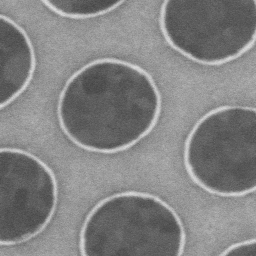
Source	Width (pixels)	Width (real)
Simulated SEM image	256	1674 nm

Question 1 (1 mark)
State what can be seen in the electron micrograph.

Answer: raised bodies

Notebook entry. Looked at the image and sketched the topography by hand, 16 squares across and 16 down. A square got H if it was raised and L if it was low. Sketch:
LLLHHHHLLLHHHHHH
HLLLLLLLLLHHHHHH
HHLLLLLLLLLHHHHH
HHLLLLLLLLLLHHHL
HHLLLHHHHLLLLLLL
HLLLHHHHHHLLLLLL
LLLLHHHHHHLLLLLL
LLLLHHHHHHLLLHHH
LLLLHHHHHLLLHHHH
HLLLLLLLLLLLHHHH
HHHLLLLLLLLLHHHH
HHHLLLLLLLLLHHHH
HHHLLLLHHHLLLLLL
HHHLLLHHHHHLLLLL
HHLLLHHHHHHLLLLL
LLLLLHHHHHHLLLHH